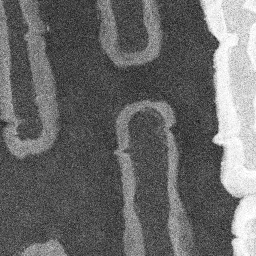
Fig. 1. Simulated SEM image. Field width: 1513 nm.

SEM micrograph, one or a few lines or trenches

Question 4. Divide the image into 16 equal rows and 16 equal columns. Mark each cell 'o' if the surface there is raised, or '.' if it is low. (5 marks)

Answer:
oo.....oo....ooo
oo.....ooo...ooo
oo.....ooo....oo
oo.....oo.....oo
ooo...........oo
ooo...........oo
ooo......o....oo
.oo.....ooo...oo
.oo....oooo...oo
........ooo...oo
........ooo....o
........ooo.....
........ooo.....
........ooo....o
........ooo....o
........ooo....o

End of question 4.